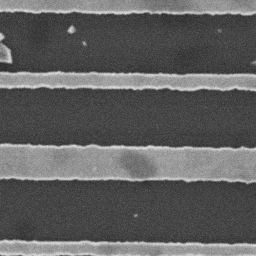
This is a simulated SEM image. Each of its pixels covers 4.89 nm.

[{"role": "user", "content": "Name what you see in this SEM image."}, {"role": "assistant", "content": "lines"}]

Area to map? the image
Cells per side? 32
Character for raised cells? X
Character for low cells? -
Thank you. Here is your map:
XXXXXXXXXXXXXXXXXXXXXXXXXXXXXXXX
----X--XX-XXXXXXXXXXXXXXXXXXXXXX
--------------------------------
--------------------------------
--------------------------------
--------------------------------
X-------------------------------
X-------------------------------
--------------------------------
XXXXXXXXXXXXXXXXXXXXXXXXXXXXXXXX
XXXXXXXXXXXXXXXXXXXXXXXXXXXXXXXX
--------------------------------
--------------------------------
--------------------------------
--------------------------------
--------------------------------
--------------------------------
--------------------------------
XXXXXXXXXXXXXXXXXXXXX--X--------
XXXXXXXXXXXXXXXXXXXXXXXXXXXXXXXX
XXXXXXXXXXXXXXXXXXXXXXXXXXXXXXXX
XXXXXXXXXXXXXXXXXXXXXXXXXXXXXXXX
----------------XX-----XX-XXXXXX
--------------------------------
--------------------------------
--------------------------------
--------------------------------
--------------------------------
--------------------------------
--------------------------------
XXXXXXXXXXXXXXXXXXXXXXXXX-------
XXXXXXXXXXXXXXXXXXXXXXXXXXXXXXXX